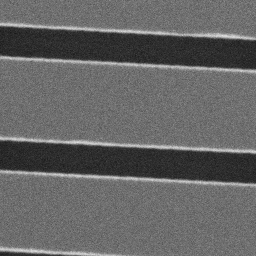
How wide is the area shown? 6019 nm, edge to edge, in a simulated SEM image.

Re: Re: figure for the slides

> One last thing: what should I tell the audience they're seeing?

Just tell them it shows lines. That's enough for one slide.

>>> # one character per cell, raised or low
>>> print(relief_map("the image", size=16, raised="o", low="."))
oooooooooooooooo
oooooooooooooooo
................
................
oooooooooooooooo
oooooooooooooooo
oooooooooooooooo
oooooooooooooooo
oooooooooooooooo
..............oo
................
ooooooooooooooo.
oooooooooooooooo
oooooooooooooooo
oooooooooooooooo
oooooooooooooooo